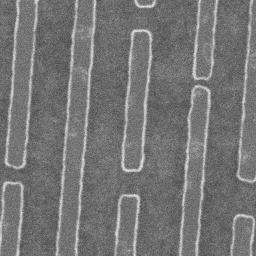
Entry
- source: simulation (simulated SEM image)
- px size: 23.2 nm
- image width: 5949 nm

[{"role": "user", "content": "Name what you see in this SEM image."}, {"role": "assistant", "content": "parallel lines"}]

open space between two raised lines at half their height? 915 nm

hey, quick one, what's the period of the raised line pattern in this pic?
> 1.38 µm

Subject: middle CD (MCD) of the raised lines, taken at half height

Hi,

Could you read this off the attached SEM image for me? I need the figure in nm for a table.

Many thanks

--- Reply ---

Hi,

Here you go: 426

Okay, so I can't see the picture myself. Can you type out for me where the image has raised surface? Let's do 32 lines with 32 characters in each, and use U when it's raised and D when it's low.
DDUUUDDDDDUUDDDDDUUDDDDDDUUDDDDU
DDUUUDDDDDUUDDDDDDDDDDDDDUUDDDDU
DDUUUDDDDUUUDDDDDDDDDDDDDUUDDDDU
DDUUDDDDDUUUDDDDDDDDDDDDDUUDDDDU
DDUUDDDDDUUUDDDDDUUDDDDDDUUDDDDU
DDUUDDDDDUUUDDDDUUUDDDDDUUUDDDDU
DDUUDDDDDUUUDDDDUUUDDDDDUUUDDDDU
DDUUDDDDDUUDDDDDUUUDDDDDUUUDDDDU
DDUUDDDDDUUDDDDDUUUDDDDDUUDDDDDU
DDUUDDDDDUUDDDDDUUUDDDDDUUDDDDDU
DDUUDDDDDUUDDDDDUUUDDDDDDDDDDDDU
DDUUDDDDDUUDDDDDUUDDDDDDUUDDDDDU
DUUUDDDDDUUDDDDDUUDDDDDDUUDDDDUU
DUUUDDDDDUUDDDDDUUDDDDDDUUDDDDUU
DUUUDDDDDUUDDDDDUUDDDDDDUUDDDDUU
DUUDDDDDUUUDDDDDUUDDDDDDUUDDDDUU
DUUDDDDDUUUDDDDDUUDDDDDDUUDDDDUU
DUUDDDDDUUUDDDDDUUDDDDDDUUDDDDUU
DUUDDDDDUUUDDDDUUUDDDDDUUUDDDDUU
DUUDDDDDUUDDDDDUUUDDDDDUUUDDDDUU
DUUDDDDDUUDDDDDUUUDDDDDUUDDDDDUU
DDDDDDDDUUDDDDDDDDDDDDDUUDDDDDUU
DDDDDDDDUUDDDDDDDDDDDDDUUDDDDDDU
DUUDDDDDUUDDDDDDDDDDDDDUUDDDDDDD
UUUDDDDDUUDDDDDDUDDDDDDUUDDDDDDD
UUUDDDDDUUDDDDDUUDDDDDDUUDDDDDDD
UUUDDDDDUUDDDDDUUDDDDDDUUDDDDDDD
UUUDDDDDUUDDDDDUUDDDDDDUUDDDDUUU
UUDDDDDUUUDDDDDUUDDDDDDUUDDDDUUU
UUDDDDDUUUDDDDDUUDDDDDDUUDDDDUUU
UUDDDDDUUUDDDDDUUDDDDDDUUDDDDUUD
UUDDDDDUUUDDDDUUUDDDDDDUUDDDDUUD